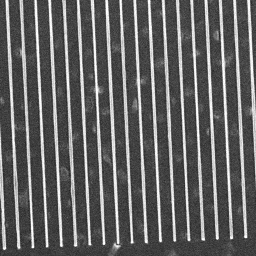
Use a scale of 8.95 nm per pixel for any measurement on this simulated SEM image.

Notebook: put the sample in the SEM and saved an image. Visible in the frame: parallel lines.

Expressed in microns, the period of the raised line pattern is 0.127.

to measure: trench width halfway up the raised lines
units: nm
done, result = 108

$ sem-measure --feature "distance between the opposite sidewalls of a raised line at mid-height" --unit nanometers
20.1